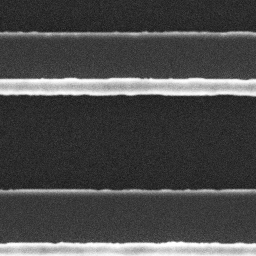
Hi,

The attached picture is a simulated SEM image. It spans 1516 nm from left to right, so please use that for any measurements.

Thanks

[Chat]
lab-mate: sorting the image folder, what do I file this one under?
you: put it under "lines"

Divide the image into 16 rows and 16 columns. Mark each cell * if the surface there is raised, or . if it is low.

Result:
................
................
****************
****************
****************
****************
................
................
................
................
................
................
****************
****************
****************
****************